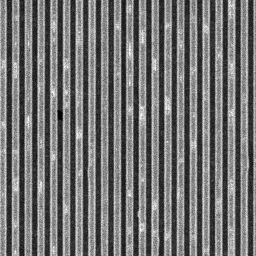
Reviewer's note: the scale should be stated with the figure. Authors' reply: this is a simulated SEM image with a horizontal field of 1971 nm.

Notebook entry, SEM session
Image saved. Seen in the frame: parallel lines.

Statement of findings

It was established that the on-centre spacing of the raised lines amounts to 97.7 nm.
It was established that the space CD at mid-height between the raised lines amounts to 0.0452 micrometres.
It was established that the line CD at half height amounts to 52.9 nanometers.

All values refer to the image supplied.